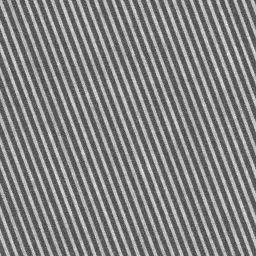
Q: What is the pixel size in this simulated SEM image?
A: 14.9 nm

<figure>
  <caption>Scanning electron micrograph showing parallel lines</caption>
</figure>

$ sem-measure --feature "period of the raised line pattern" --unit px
8.14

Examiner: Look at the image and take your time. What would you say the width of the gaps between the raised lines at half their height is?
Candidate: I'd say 5.98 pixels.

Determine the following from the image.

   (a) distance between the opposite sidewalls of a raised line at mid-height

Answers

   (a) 0.0386 microns